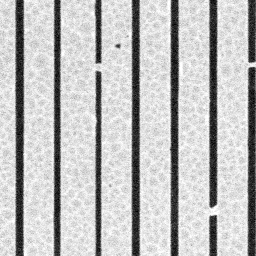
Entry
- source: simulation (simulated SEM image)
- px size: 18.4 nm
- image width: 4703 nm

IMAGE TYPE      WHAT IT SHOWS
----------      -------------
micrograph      parallel lines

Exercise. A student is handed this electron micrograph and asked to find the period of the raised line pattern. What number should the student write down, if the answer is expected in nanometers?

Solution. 711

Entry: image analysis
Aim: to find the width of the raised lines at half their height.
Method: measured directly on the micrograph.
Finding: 0.533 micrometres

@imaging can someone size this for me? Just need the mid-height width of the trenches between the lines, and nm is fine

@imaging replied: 172